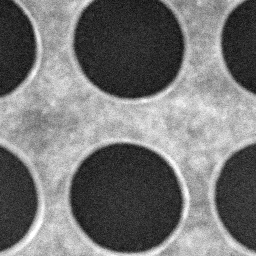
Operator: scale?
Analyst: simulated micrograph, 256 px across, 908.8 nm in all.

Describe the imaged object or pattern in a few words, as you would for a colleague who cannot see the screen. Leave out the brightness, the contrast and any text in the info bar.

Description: holes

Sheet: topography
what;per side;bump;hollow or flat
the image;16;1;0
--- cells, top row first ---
0111100000011110
0011100000011100
0011000000001100
0011100000001100
0011100000011100
0111110000111110
1111111111111111
1111111111111111
1111111111111111
0111110000111110
0011100000011100
0011000000011000
0011000000001000
0011000000011100
0011100000011100
0111110000111110